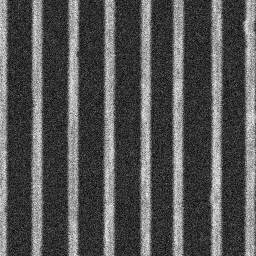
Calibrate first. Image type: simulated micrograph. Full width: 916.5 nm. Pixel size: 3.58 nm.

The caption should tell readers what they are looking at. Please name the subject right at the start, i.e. parallel lines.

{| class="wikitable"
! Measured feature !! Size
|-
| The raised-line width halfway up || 7.99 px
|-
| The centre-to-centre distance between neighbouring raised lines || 127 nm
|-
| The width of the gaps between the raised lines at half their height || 99.3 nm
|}